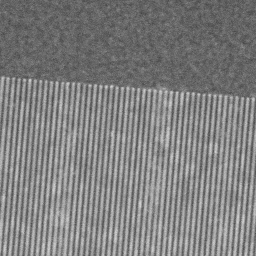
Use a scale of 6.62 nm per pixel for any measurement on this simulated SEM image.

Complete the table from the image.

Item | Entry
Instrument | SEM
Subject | parallel lines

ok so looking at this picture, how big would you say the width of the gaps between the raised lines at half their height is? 22.2 nm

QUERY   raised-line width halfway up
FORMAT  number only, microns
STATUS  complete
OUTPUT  0.014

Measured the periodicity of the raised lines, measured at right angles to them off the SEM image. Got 0.0358 µm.